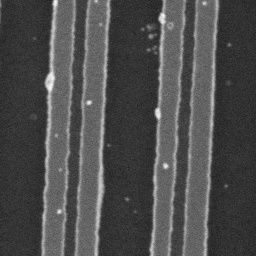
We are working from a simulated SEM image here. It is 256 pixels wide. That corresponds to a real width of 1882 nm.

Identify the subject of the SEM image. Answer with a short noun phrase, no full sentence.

lines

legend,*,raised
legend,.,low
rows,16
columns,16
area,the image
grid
...****...****..
...****...****..
...****...***...
...****...***...
...****...***...
...****...***...
...***....***...
...***....***...
...***....***...
...***....***...
...***....***...
...***....***...
...***....***...
...***....***...
...***....***...
...***...****...